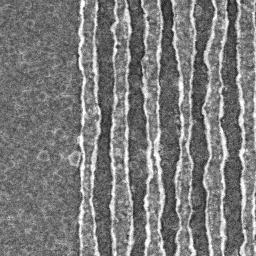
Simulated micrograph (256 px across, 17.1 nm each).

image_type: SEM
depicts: parallel lines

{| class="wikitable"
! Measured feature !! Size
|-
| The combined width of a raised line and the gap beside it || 544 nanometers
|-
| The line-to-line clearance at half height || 321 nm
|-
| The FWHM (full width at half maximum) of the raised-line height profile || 231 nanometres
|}